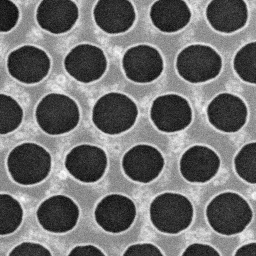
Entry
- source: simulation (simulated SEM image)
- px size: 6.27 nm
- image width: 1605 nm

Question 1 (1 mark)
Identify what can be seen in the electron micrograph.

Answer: a regular array of holes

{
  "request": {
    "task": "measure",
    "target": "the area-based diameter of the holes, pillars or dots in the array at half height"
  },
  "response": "255 nm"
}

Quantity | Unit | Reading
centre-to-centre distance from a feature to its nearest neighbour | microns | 0.353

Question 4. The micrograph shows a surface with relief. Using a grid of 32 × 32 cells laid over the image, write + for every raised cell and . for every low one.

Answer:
..+++....+++....+++....+++.....+
..++......++.....++.....++.....+
..+++.....++.....++.....++.....+
..+++....+++....++++...++++...++
++++++++++++++++++++++++++++++++
++++++++++.++++++++++++++++++++.
+.....+++....+++....+++....+++..
+.....++.....++.....++......+...
+.....++.....++.....++......+...
+.....+++....+++....+++....+++..
+++.++++++++++++++++++++++++++++
++++++++++++++++++++++++++++++++
..+++....+++.....++....++++...++
...++.....++.....++.....++.....+
...+......++.....++.....++.....+
...++.....++.....++.....++.....+
.+++++...++++...++++..++++++.+++
++++++++++++++++++++++++++++++++
++...++++....+++...+++++..++++..
+.....++.....++.....+++....++...
+.....++.....++.....++.....++...
+.....+++....++.....+++....+++..
++...+++++..+++++..++++...++++..
++++++++++++++++++++++++++++++++
.++++++.+++++...++++...++++...++
..+++....+++.....++.....++.....+
...++.....++.....++.....++.....+
...++.....++.....++.....++.....+
..+++....++++...+++....++++....+
++++++++++++++++++++++++++++++++
+++..++++++++++++..+++++..+++++.
+.....+++....+++....+++....++...